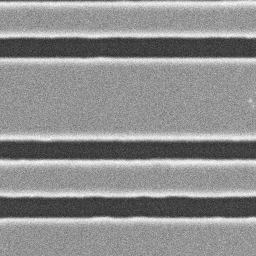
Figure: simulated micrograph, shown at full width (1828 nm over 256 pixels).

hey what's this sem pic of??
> lines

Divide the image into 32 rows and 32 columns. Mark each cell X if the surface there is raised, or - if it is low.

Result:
XXXXXXXXXXXXXXXXXXXXXXXXXXXXXXXX
XXXXXXXXXXXXXXXXXXXXXXXXXXXXXXXX
XXXXXXXXXXXXXXXXXXXXXXXXXXXXXXXX
XXXXXXXXXXXXXXXXXXXXXXXXXXXXXXXX
XXXXXXXXXXXXXXXXXXXXXXXXXXXXXXXX
--------------------------------
--------------------------------
XXXXXXXXXXXXXXXXXXXXXXXXXXXXXXXX
XXXXXXXXXXXXXXXXXXXXXXXXXXXXXXXX
XXXXXXXXXXXXXXXXXXXXXXXXXXXXXXXX
XXXXXXXXXXXXXXXXXXXXXXXXXXXXXXXX
XXXXXXXXXXXXXXXXXXXXXXXXXXXXXXXX
XXXXXXXXXXXXXXXXXXXXXXXXXXXXXXXX
XXXXXXXXXXXXXXXXXXXXXXXXXXXXXXXX
XXXXXXXXXXXXXXXXXXXXXXXXXXXXXXXX
XXXXXXXXXXXXXXXXXXXXXXXXXXXXXXXX
XXXXXXXXXXXXXXXXXXXXXXXXXXXXXXXX
--------------------------------
--------------------------------
--------------------------------
XXXXXXXXXXXXXXXXXXXXXXXXXXXXXXXX
XXXXXXXXXXXXXXXXXXXXXXXXXXXXXXXX
XXXXXXXXXXXXXXXXXXXXXXXXXXXXXXXX
XXXXXXXXXXXXXXXXXXXXXXXXXXXXXXXX
-XXXXXXXXXX--XXXXXXXX--XXXXXXX--
--------------------------------
--------------------------------
XXXXXXXXXXXXXXXXXXXXXXXXXXXXXXXX
XXXXXXXXXXXXXXXXXXXXXXXXXXXXXXXX
XXXXXXXXXXXXXXXXXXXXXXXXXXXXXXXX
XXXXXXXXXXXXXXXXXXXXXXXXXXXXXXXX
XXXXXXXXXXXXXXXXXXXXXXXXXXXXXXXX